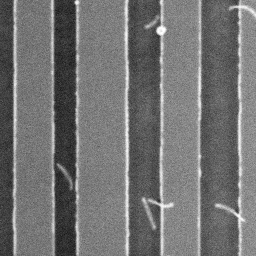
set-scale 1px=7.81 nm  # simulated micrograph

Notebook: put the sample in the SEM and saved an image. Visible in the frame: lines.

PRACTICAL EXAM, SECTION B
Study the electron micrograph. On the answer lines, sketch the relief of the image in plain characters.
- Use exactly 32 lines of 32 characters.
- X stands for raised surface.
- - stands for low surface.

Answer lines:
--XXXXX---XXXXXX----XXXXX-----XX
--XXXXX---XXXXXX----XXXXX-----XX
--XXXXX---XXXXXX----XXXXX-----XX
--XXXXX---XXXXXX----XXXXX-----XX
--XXXXX---XXXXXX----XXXXX-----XX
--XXXXX---XXXXXX----XXXXX-----XX
--XXXXX---XXXXXX----XXXXX-----XX
--XXXXX---XXXXXX----XXXXX-----XX
--XXXXX---XXXXXX----XXXXX-----XX
--XXXXX---XXXXXX----XXXXX-----XX
--XXXXX---XXXXXX----XXXXX-----XX
--XXXXX---XXXXXX----XXXXX-----XX
--XXXXX---XXXXXX----XXXXX-----XX
--XXXXX---XXXXXX----XXXXX-----XX
--XXXXX---XXXXXX----XXXXX-----XX
--XXXXX---XXXXXX----XXXXX-----XX
--XXXXX---XXXXXX----XXXXX-----XX
--XXXXX---XXXXXX----XXXXX-----XX
--XXXXX---XXXXXX----XXXXX-----XX
--XXXXX---XXXXXX----XXXXX-----XX
--XXXXX---XXXXXX----XXXXX-----XX
--XXXXX---XXXXXX----XXXXX-----XX
--XXXXX---XXXXXX----XXXXX-----XX
--XXXXX---XXXXXX----XXXXX-----XX
--XXXXX---XXXXXX----XXXXX-----XX
--XXXXX---XXXXXX----XXXXX-----XX
--XXXXX---XXXXXX----XXXXX-----XX
--XXXXX---XXXXXX----XXXXX-----XX
--XXXXX---XXXXXX----XXXXX-----XX
--XXXXX---XXXXXX----XXXXX-----XX
--XXXXX---XXXXXX----XXXXX-----XX
--XXXXX---XXXXXX----XXXXX-----XX